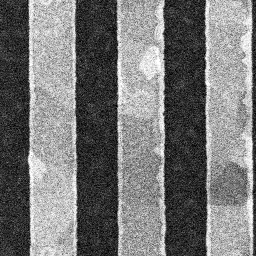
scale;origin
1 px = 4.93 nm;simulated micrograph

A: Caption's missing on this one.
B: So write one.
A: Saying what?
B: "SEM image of one or a few lines or trenches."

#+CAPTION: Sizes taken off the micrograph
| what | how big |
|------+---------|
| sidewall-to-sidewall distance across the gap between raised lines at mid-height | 0.215 um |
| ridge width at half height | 0.219 µm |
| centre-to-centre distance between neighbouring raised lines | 88.2 pixels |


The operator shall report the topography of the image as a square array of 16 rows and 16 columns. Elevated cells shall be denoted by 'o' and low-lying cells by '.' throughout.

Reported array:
..ooo..ooo...ooo
..ooo..ooo...ooo
..ooo..ooo...ooo
..ooo..ooo...ooo
..ooo..ooo...ooo
..ooo..ooo...ooo
..ooo..ooo...ooo
..ooo..ooo...ooo
..ooo..ooo...ooo
..ooo..ooo...ooo
..ooo..ooo...ooo
..ooo..ooo...ooo
..ooo..ooo...ooo
..ooo..ooo...ooo
..ooo..ooo...ooo
..ooo..ooo...ooo